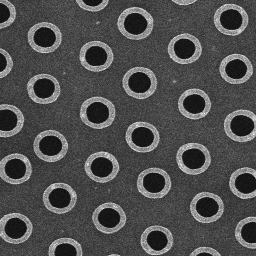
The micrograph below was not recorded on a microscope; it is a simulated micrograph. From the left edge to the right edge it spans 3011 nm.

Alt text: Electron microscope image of a regular array of ring-shaped raised bodies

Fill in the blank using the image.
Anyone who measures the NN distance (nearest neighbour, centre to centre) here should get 604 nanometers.